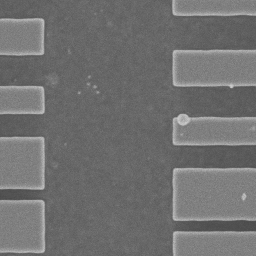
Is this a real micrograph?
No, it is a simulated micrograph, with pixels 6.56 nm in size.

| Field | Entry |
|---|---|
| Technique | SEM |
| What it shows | groups of lines, slits or small figures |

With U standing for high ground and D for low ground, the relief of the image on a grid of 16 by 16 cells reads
DDDDDDDDDDDUUUUU
UUUDDDDDDDDDDDDD
UUUDDDDDDDDDDDDD
DDDDDDDDDDDUUUUU
DDDDDDDDDDDUUUUU
UUDDDDDDDDDDDDDD
UUUDDDDDDDDDDDDD
DDDDDDDDDDDUUUUU
DDDDDDDDDDDUUUUU
UUUDDDDDDDDDDDDD
UUUDDDDDDDDDDDDD
UUUDDDDDDDDUUUUU
UUDDDDDDDDDUUUUU
UUUDDDDDDDDUUUUU
UUUDDDDDDDDUDUUU
UUUDDDDDDDDUUUUU